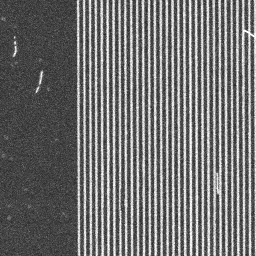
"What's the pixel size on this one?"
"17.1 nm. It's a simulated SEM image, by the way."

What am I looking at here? parallel lines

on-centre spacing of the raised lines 0.101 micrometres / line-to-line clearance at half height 70.5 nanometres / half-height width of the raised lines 32.1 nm